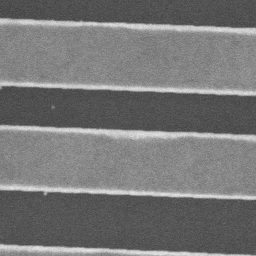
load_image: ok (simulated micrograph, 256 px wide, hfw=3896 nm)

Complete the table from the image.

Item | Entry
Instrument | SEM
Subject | lines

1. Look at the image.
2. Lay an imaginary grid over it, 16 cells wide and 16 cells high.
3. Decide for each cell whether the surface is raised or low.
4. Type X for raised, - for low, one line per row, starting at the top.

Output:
----------------
XXXXXXX---------
XXXXXXXXXXXXXXXX
XXXXXXXXXXXXXXXX
XXXXXXXXXXXXXXXX
----XXXXXXXXXXXX
----------------
----------------
XXXXXXXXXXXXXXXX
XXXXXXXXXXXXXXXX
XXXXXXXXXXXXXXXX
XXXXXXXXXXXXXXXX
----------------
----------------
----------------
XXXX------------